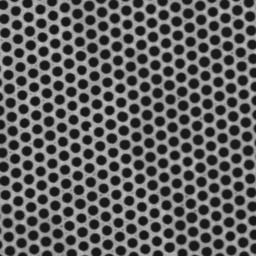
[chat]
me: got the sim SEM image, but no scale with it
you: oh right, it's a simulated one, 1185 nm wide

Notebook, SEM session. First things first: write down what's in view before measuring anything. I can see a regular array of holes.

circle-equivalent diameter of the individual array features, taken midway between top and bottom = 46.7 nanometres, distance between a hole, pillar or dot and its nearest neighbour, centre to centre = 0.0642 um